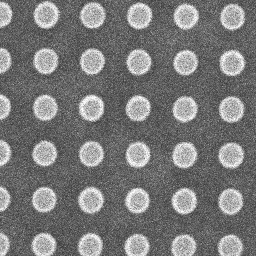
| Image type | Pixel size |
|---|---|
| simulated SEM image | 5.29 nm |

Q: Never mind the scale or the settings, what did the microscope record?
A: a regular array of raised bodies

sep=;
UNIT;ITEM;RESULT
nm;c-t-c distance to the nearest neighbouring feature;242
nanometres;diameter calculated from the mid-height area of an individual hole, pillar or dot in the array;120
